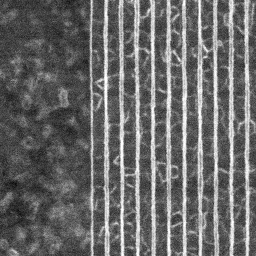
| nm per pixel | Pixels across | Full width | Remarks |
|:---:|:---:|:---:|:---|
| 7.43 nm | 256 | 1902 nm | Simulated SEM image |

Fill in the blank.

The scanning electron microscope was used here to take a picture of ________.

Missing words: parallel lines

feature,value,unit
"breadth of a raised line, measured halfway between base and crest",21.4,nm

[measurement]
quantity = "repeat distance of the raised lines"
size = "116 nanometers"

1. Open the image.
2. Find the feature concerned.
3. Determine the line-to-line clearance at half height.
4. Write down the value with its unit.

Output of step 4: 95.7 nm